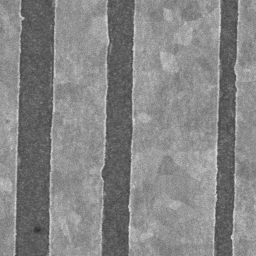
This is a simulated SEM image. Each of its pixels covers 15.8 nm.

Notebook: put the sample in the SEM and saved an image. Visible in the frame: one or a few lines or trenches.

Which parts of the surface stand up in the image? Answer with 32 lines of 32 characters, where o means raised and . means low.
ooo....oooooo....oooooooooo...oo
ooo....oooooo....oooooooooo...oo
ooo....oooooo....oooooooooo...oo
ooo....oooooo....oooooooooo...oo
oo.....ooooooo...oooooooooo...oo
ooo....ooooooo...oooooooooo...oo
ooo....ooooooo...oooooooooo...oo
oo.....oooooo....oooooooooo...oo
oo.....oooooo....oooooooooo..ooo
oo...o.oooooo....oooooooooo..ooo
oo.....oooooo....oooooooooo..ooo
oo.....oooooo....oooooooooo...oo
oo.....oooooo....oooooooooo...oo
oo.....oooooo....oooooooooo..ooo
oo.....oooooo....oooooooooo..ooo
oo.....oooooo....oooooooooo..ooo
oo....ooooooo....oooooooooo..ooo
oo....ooooooo....oooooooooo...oo
oo....ooooooo...ooooooooooo..ooo
oo....ooooooo....oooooooooo..ooo
oo....ooooooo...ooooooooooo..ooo
oo....ooooooo...ooooooooooo..ooo
oo....ooooooo...ooooooooooo..ooo
oo....ooooooo...ooooooooooo..ooo
oo....ooooooo...ooooooooooo..ooo
oo....ooooooo...ooooooooooo..ooo
oo....ooooooo...ooooooooooo..ooo
oo....ooooooo...ooooooooooo..ooo
oo....ooooooo...ooooooooooo..ooo
oo....ooooooo...ooooooooooo..ooo
oo....ooooooo...ooooooooooo..ooo
oo....ooooooo...ooooooooooo..ooo